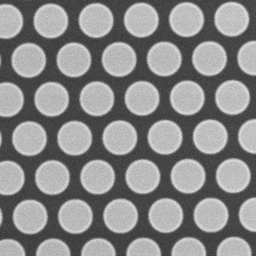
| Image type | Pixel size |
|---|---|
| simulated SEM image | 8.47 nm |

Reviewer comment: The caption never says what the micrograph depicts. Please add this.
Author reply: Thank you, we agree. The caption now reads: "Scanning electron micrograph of an array of small figures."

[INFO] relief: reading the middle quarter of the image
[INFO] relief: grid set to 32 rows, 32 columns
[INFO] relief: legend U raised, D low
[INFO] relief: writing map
UUUUUUDDDDUUUUUUUUDDDUUUUUUUUDDD
UUUUUUDDDDUUUUUUUDDDDDUUUUUUDDDD
UUUUUDDDDDDDUUUUDDDDDDDUUUUDDDDD
DDDDDDDDDDDDDDDDDDDDDDDDDDDDDDDD
DDDDDDDUUDDDDDDDDDUUDDDDDDDDDDUU
DDDDDUUUUUUDDDDDDUUUUUDDDDDDUUUU
UDDDDUUUUUUUDDDDUUUUUUUDDDDUUUUU
UDDDUUUUUUUUDDDDUUUUUUUUDDDUUUUU
UDDDUUUUUUUUDDDUUUUUUUUUDDDUUUUU
UDDDUUUUUUUUDDDUUUUUUUUUDDDUUUUU
UDDDUUUUUUUUDDDDUUUUUUUDDDDUUUUU
DDDDDUUUUUUDDDDDUUUUUUUDDDDDUUUU
DDDDDDUUUUDDDDDDDDUUUDDDDDDDDUUU
DDDDDDDDDDDDDDDDDDDDDDDDDDDDDDDD
DDUUDDDDDDDDUUUUDDDDDDDDUUUDDDDD
UUUUUUDDDDDUUUUUUDDDDDUUUUUUUDDD
UUUUUUDDDDUUUUUUUUDDDUUUUUUUUDDD
UUUUUUUDDDUUUUUUUUDDDUUUUUUUUDDD
UUUUUUUDDDUUUUUUUUDDDUUUUUUUUDDD
UUUUUUUDDDUUUUUUUUDDDUUUUUUUUDDD
UUUUUUDDDDUUUUUUUUDDDDUUUUUUUDDD
UUUUUUDDDDDUUUUUUDDDDDUUUUUUDDDD
DUUUDDDDDDDDDUUDDDDDDDDDDDDDDDDD
DDDDDDDDDDDDDDDDDDDDDDDDDDDDDDDD
DDDDDDUUUUDDDDDDDDUUUUDDDDDDDUUU
DDDDDUUUUUUUDDDDUUUUUUUDDDDUUUUU
UDDDDUUUUUUUDDDDUUUUUUUUDDDUUUUU
UDDDUUUUUUUUUDDUUUUUUUUUDDDUUUUU
UDDDUUUUUUUUUDDUUUUUUUUUDDDUUUUU
UDDDUUUUUUUUUDDDUUUUUUUUDDDUUUUU
UDDDDUUUUUUUDDDDUUUUUUUDDDDDUUUU
DDDDDDUUUUUDDDDDDUUUUUUDDDDDUUUU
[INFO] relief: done